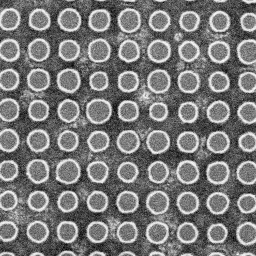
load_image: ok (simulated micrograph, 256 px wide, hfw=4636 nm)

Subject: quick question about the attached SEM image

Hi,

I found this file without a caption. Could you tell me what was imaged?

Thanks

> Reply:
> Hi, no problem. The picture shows a regular array of raised bodies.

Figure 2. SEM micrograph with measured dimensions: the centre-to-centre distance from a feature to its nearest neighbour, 29.6 px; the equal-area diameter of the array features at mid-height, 366 nanometers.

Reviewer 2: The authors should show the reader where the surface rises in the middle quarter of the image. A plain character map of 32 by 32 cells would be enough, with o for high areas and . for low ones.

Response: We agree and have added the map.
................................
.......................o........
ooo.....oo.....ooo....oooo...ooo
oooo...oooo...oooo...ooooo...ooo
oooo...oooo...ooooo..ooooo...ooo
oooo...oooo...oooo...ooooo...ooo
ooo............oo.....ooo....ooo
................................
................................
oo.....oooo.....................
ooo...oooooo..oooo....ooo....ooo
oooo..oooooo..oooo....oooo...ooo
oooo..oooooo..oooo....oooo...ooo
ooo...ooooo...oooo....ooo....ooo
.......oo.......................
................................
................................
ooo....ooo....oooo...oooo.....oo
ooo...ooooo...ooooo..ooooo...ooo
ooo...ooooo..oooooo..ooooo..oooo
ooo....oooo...ooooo..ooooo...ooo
oo.....oo......oo.....ooo.....oo
................................
................................
ooo...........................oo
ooo...ooooo...oooo....ooo....ooo
oooo..ooooo...oooo...ooooo..oooo
oooo..ooooo...oooo...ooooo..oooo
ooo....ooo....oooo....ooo....ooo
oo......o..............o......oo
................................
................................